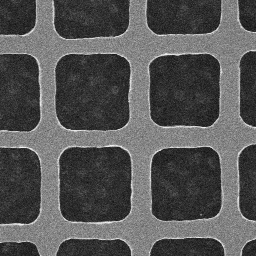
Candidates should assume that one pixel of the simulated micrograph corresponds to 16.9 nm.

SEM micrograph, holes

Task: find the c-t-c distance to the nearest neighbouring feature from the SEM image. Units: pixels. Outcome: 91.5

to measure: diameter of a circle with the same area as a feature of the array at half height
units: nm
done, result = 1350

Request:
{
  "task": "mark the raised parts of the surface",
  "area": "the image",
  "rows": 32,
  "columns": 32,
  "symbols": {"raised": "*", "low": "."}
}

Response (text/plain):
.....**.........**..........**..
.....**.........**..........**..
....***.........**..........**..
....***.........***........***..
********.......*****************
********************************
*******************************.
.....**.........***........***..
.....**.........***.........**..
.....**.........***.........**..
.....**.........***.........**..
.....**.........***.........**..
.....**.........***.........**..
.....**.........***........***..
.....**.........***........***..
.....***........****.......****.
********************************
********************************
..******.......******.....*****.
.....***........***........***..
.....**.........***.........**..
.....**.........***.........**..
.....**.........***.........**..
.....**.........***.........**..
.....**.........***.........**..
.....**.........***.........**..
.....***........***........***..
....****.......*****....*******.
********************************
********************************
....****........***.........***.
.....**.........***.........**..